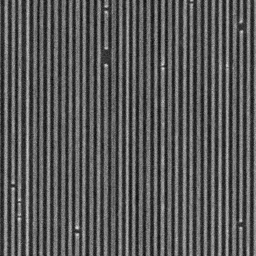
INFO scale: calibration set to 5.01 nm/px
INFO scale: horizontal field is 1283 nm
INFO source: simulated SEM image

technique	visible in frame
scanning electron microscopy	parallel lines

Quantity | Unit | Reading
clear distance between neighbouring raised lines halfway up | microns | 0.0225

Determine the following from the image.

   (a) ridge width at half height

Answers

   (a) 0.0138 um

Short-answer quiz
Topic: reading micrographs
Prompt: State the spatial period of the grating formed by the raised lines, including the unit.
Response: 0.0357 µm